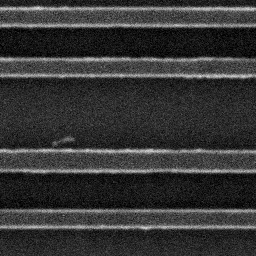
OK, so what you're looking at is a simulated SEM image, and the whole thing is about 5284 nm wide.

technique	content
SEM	lines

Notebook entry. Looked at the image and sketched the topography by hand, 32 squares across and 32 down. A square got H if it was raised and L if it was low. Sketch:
LLLLLLLLLLLLLLLLLLLLLLLLLLLLLLLL
HHHHHHHHHHHHHHHHHHHHHHHHHHHHHHHH
HHHHHHHHHHHHHHHHHHHHHHHHHHHHHHHH
LLLLLLLLLLLLLLLLLLLLLLLLLLLLLLLL
LLLLLLLLLLLLLLLLLLLLLLLLLLLLLLLL
LLLLLLLLLLLLLLLLLLLLLLLLLLLLLLLL
LLLLLLLLLLLLLLLLLLLLLLLLLLLLLLLL
HHHHHHHHHHHHHHHHHHHHHHHHHHHHHHHH
HHHHHHHHHHHHHHHHHHHHHHHHHHHHHHHH
LLLLLLLLLLLLLLLLLLLLLLLHLLLHHHHL
LLLLLLLLLLLLLLLLLLLLLLLLLLLLLLLL
LLLLLLLLLLLLLLLLLLLLLLLLLLLLLLLL
LLLLLLLLLLLLLLLLLLLLLLLLLLLLLLLL
LLLLLLLLLLLLLLLLLLLLLLLLLLLLLLLL
LLLLLLLLLLLLLLLLLLLLLLLLLLLLLLLL
LLLLLLLLLLLLLLLLLLLLLLLLLLLLLLLL
LLLLLLLLLLLLLLLLLLLLLLLLLLLLLLLL
LLLLLLLLLLLLLLLLLLLLLLLLLLLLLLLL
LLLLLLLLLLLLLLLLLLLLLLLLLLLLLLLL
HHHHHHHHHHHHHHHHHHHHHHHHHHHHHHHH
HHHHHHHHHHHHHHHHHHHHHHHHHHHHHHHH
LLLLLLLLLLLLLLLLLLLLLLLLLLLLLLLL
LLLLLLLLLLLLLLLLLLLLLLLLLLLLLLLL
LLLLLLLLLLLLLLLLLLLLLLLLLLLLLLLL
LLLLLLLLLLLLLLLLLLLLLLLLLLLLLLLL
LLLLLLLLLLLLLLLLLLLLLLLLLLLLLLLL
HHHHHHHHHHHHHHHHHHHHHHHHHHHHHHHH
HHHHHHHHHHHHHHHHHHHHHHHHHHHHHHHH
LLLLLLLLLLLLLLLLLLLLLLLLLLLLLLLL
LLLLLLLLLLLLLLLLLLLLLLLLLLLLLLLL
LLLLLLLLLLLLLLLLLLLLLLLLLLLLLLLL
LLLLLLLLLLLLLLLLLLLLLLLLLLLLLLLL